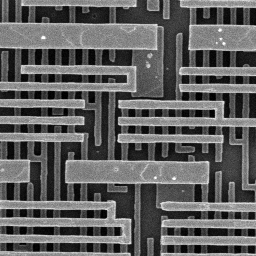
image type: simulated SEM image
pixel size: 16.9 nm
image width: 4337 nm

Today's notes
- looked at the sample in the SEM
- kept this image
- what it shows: wiring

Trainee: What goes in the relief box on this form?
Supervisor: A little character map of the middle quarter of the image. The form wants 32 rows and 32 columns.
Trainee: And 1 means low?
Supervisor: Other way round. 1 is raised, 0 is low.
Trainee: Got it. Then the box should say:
00111111100000000000000000000000
11111111111111111100000000000111
00001111111111111100000000000111
00000000000000001100000000000000
00000000000000001100000000000000
11111111111111111100000000000111
11111111111111111100000000000111
00000000000000000000000000000000
00000000000000000000000000000000
11111000000000111111111111111111
11111000000000111111111111111111
00000000000000000000000000000000
00000000000000000000000000000000
11111000000000111111111111111111
11111000000000111111111111111111
00000000000000000000000000000000
00000000000000000000000000000000
11110000000000000000000000000000
11111000000001111111111111111111
00000000000000111111111000011111
00000000000000000000000000000000
00000000000000000000000000000000
00000000000000000000000000000000
00000000000000000000000000000000
11111111111111111111111111111000
11111111111111111111111111111111
11111111111111111111111111111111
11111111111111111111111111111111
11111111111111111111111111111111
11111111111111111111111111111111
00000000000000000000000000000000
00000000000000000000000000000000